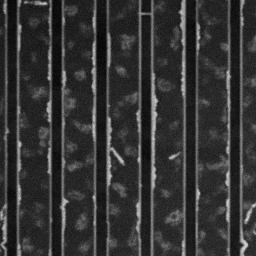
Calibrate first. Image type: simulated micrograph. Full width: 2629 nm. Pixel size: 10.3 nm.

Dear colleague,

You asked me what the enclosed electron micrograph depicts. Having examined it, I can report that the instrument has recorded parallel lines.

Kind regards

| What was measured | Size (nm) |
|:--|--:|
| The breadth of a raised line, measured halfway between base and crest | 336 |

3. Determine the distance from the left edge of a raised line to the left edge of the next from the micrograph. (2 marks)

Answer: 458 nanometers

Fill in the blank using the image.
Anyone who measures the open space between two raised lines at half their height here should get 118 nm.